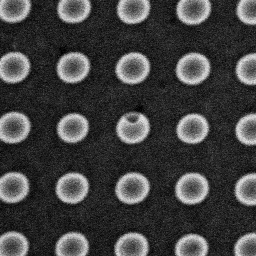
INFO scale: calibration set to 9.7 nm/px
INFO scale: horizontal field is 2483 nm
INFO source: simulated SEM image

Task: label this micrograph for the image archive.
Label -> a regular array of raised bodies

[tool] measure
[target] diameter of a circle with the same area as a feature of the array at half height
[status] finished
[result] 285 nm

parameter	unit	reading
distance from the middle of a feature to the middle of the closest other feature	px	59.7